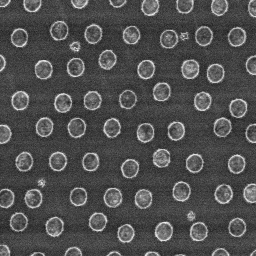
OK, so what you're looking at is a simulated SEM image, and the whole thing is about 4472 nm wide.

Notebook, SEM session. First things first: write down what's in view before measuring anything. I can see a regular array of raised bodies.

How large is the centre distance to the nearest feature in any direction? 31 px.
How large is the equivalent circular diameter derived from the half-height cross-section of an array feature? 306 nm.